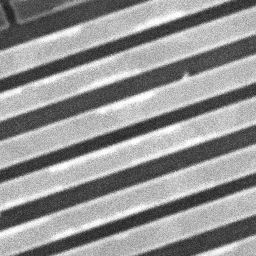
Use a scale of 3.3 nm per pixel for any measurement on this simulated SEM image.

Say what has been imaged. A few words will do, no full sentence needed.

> parallel lines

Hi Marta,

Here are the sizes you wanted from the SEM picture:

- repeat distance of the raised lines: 141 nanometres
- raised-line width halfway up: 82.5 nm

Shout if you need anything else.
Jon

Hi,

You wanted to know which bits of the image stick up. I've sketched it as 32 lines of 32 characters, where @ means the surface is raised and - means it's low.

-@@@@@@@@---------@@@@@@@@@-----
--@@@@@--------@@@@@@@@@------@@
@-@@--------@@@@@@@@@------@@@@@
@--------@@@@@@@@@@-----@@@@@@@@
------@@@@@@@@@-------@@@@@@@@@-
---@@@@@@@@@@------@@@@@@@@@----
@@@@@@@@@@------@@@@@@@@@-------
@@@@@@@------@@@@@@@@@--------@@
@@@@------@@@@@@@@@--------@@@@@
@------@@@@@@@@@--------@@@@@@@@
----@@@@@@@@@--------@@@@@@@@@@-
-@@@@@@@@@---------@@@@@@@@@----
@@@@@@@---------@@@@@@@@@------@
@@@@---------@@@@@@@@@------@@@@
@@--------@@@@@@@@@------@@@@@@@
-------@@@@@@@@@------@@@@@@@@@@
----@@@@@@@@@------@@@@@@@@@@---
-@@@@@@@@@@-----@@@@@@@@@@------
@@@@@@@@-----@@@@@@@@@@--------@
@@@@@-----@@@@@@@@@@--------@@@@
@@-----@@@@@@@@@@--------@@@@@@@
-----@@@@@@@@@--------@@@@@@@@@@
--@@@@@@@@@--------@@@@@@@@@@---
@@@@@@@@---------@@@@@@@@@------
@@@@@---------@@@@@@@@@------@@@
@@---------@@@@@@@@@------@@@@@@
--------@@@@@@@@@------@@@@@@@@@
-----@@@@@@@@@------@@@@@@@@@---
--@@@@@@@@@------@@@@@@@@@------
@@@@@@@@------@@@@@@@@@@--------
@@@@@------@@@@@@@@@@--------@@@
@@------@@@@@@@@@@--------@@@@@@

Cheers